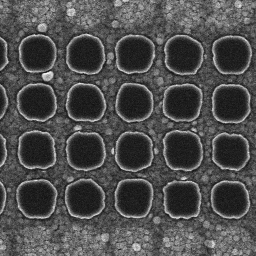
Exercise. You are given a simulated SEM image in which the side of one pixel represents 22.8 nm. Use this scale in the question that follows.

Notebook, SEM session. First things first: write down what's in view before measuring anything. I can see a regular array of raised bodies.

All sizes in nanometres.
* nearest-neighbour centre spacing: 1090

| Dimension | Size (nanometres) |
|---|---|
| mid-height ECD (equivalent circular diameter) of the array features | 900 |